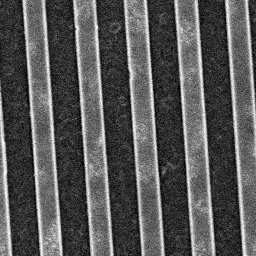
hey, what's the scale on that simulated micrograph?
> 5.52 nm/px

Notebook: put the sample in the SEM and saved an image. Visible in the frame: parallel lines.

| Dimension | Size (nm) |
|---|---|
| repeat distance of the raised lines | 279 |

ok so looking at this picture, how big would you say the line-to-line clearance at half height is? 161 nm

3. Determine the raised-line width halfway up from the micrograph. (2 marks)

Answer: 0.118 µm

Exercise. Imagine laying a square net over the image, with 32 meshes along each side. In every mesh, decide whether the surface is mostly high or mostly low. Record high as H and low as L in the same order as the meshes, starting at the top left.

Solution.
LLLHHHLLLHHHLLLLHHLLLLHHHLLLHHHL
LLLHHHLLLHHHLLLLHHLLLLHHHLLLHHHL
LLLHHHLLLHHHLLLLHHLLLLHHHLLLHHHL
LLLHHHLLLLHHLLLLHHLLLLHHHLLLHHHL
LLLHHHLLLLHHLLLLHHHLLLHHHLLLLHHL
LLLHHHLLLLHHLLLLHHHLLLHHHLLLLHHL
LLLHHHLLLLHHLLLLHHHLLLHHHLLLLHHL
LLLHHHLLLLHHLLLLHHHLLLHHHLLLLHHL
LLLLHHLLLLHHLLLLHHHLLLLHHLLLLHHH
LLLLHHLLLLHHHLLLHHHLLLLHHLLLLHHH
LLLLHHLLLLHHHLLLHHHLLLLHHLLLLHHH
LLLLHHLLLLHHHLLLHHHLLLLHHLLLLHHH
LLLLHHLLLLHHHLLLHHHLLLLHHLLLLHHH
LLLLHHLLLLHHHLLLLHHLLLLHHLLLLHHH
LLLLHHLLLLHHHLLLLHHLLLLHHHLLLHHH
LLLLHHHLLLHHHLLLLHHLLLLHHHLLLHHH
LLLLHHHLLLHHHLLLLHHLLLLHHHLLLHHH
LLLLHHHLLLHHHLLLLHHLLLLHHHLLLHHH
HLLLHHHLLLLHHLLLLHHLLLLHHHLLLLHH
HLLLHHHLLLLHHLLLLHHHLLLHHHLLLLHH
HLLLHHHLLLLHHLLLLHHHLLLHHHLLLLHH
HLLLHHHLLLLHHLLLLHHHLLLHHHLLLLHH
HLLLLHHLLLLHHLLLLHHHLLLHHHLLLLHH
HLLLHHHLLLLHHLLLLHHHLLLLHHLLLLHH
HLLLLHHLLLLHHLLLLHHHLLLLHHLLLLHH
HLLLLHHLLLLHHHLLLHHHLLLLHHLLLLHH
HLLLLHHLLLLHHHLLLHHHLLLLHHLLLLHH
HLLLLHHLLLLHHHLLLLHHLLLLHHHLLLHH
HLLLLHHLLLLHHHLLLLHHLLLLHHHLLLHH
HLLLLHHHLLLHHHLLLLHHLLLLHHHLLLHH
HLLLLHHHLLLHHHLLLLHHLLLLHHHLLLHH
HLLLLHHHLLLHHHLLLLHHLLLLHHHLLLHH